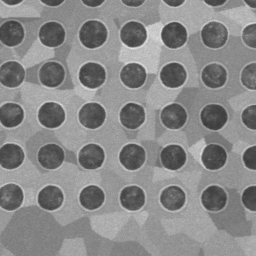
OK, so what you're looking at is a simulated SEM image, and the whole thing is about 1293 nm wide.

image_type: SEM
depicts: a regular array of holes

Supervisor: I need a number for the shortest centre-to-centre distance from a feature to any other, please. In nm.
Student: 202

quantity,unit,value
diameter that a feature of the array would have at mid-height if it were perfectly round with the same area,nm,136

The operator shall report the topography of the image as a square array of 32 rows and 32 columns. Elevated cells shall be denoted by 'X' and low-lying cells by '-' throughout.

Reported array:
X-XXX---XXX--XXX--XXX--XXX--XXX-
XXXXXXXXXXXXXXXXXXXXXXXXXXXXXXXX
X-XXXXXXXXXXXXXXXXXXXXXXXXXXXXXX
---XX---XX---XX---XX---XX---XXX-
---XX---XX---XX---XX---XX---XX--
--XXX---XX---XXX--XXX--XXX--XXX-
XXXXXXXXXXXXXXXXXXXXXXXXXXXXXXXX
XXXXXXXXXXXXXXXXXXXXXXXXXXXXXXXX
---XX---XX---XX---XX---XXX--XXX-
---XX---XX---XX---XX---XX---XX--
---XX---XX---XX---XX---XXX--XX--
XXXXXXXXXXXXXXXXXXXXXXXXXXXXXXXX
XXXXXXXXXXXXXXXXXXXXXXXXXXXXXXXX
---XX---XX---XX---XXX--XXX--XXX-
---XX---XX---XX---XX---XX---XX--
--XXX---XX---XX---XX---XX---XX--
XXXXXXXXXXXXXXXXXXXXXXXXXXXXXXXX
XXXXXXXXXXXXXXXXXXXXXXXXXXXXXXXX
---XX---XX---XX---XX---XXX--XXX-
---XX---XX---XX---XX---XX---XX--
---XX---XX---XX---XX---XX---XXX-
XXXXXXXXXXXXXXXXXXXXXXXXXXXXXXXX
XXXXXXXXXXXXXXXXXXXXXXXXXXXXXXXX
---XX--XXX--XXXX--XXX--XXX--XXX-
---XX---XX---XX---XX---XX---XX--
---XX---XX---XX---XX---XX---XX--
XXXXXXXXXXXXXXXXXXXXXXXXXXXXXXXX
XXXXXXXXXXXXXXXXXXXXXXXXXXXXXXXX
XXXXXXXXXXXXXXXXXXXXXXXXXXXXXXXX
XXXXXXXXXXXXXXXXXXXXXXXXXXXXXXXX
XXXXXXXXXXXXXXXXXXXXXXXXXXXXXXXX
XXXXXXXXXXXXXXXXXXXXXXXXXXXXXXXX